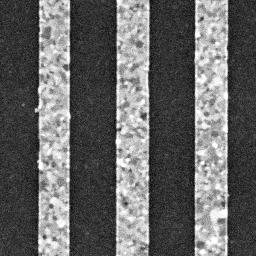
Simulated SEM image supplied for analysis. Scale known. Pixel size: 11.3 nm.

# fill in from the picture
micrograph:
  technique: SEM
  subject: one or a few lines or trenches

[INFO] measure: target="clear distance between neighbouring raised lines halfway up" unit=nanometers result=555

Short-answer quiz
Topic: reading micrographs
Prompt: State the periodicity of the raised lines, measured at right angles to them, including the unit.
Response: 891 nm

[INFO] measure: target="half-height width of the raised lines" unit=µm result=0.346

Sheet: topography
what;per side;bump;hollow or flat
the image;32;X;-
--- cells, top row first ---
-----XXXX------XXX-------XXX----
-----XXXX------XXX-------XXX----
-----XXXX------XXX-------XXX----
-----XXXX------XXX-------XXX----
-----XXXX------XXX-------XXX----
-----XXXX------XXX-------XXX----
-----XXXX------XXX-------XXX----
-----XXXX------XXX------XXXX----
-----XXXX------XXX-------XXX----
-----XXXX------XXX-------XXX----
-----XXXX------XXX-------XXX----
-----XXXX------XXX-------XXX----
-----XXXX------XXX-------XXX----
-----XXXX------XXX-------XXX----
-----XXXX------XXX-------XXX----
-----XXXX------XXX-------XXX----
-----XXXX------XXX-------XXX----
-----XXXX------XXX-------XXX----
-----XXX-------XXX-------XXX----
-----XXX-------XXX-------XXX----
-----XXX-------XXX-------XXX----
-----XXX-------XXX-------XXX----
-----XXX-------XXX-------XXX----
-----XXX-------XXX-------XXX----
-----XXX-------XXX-------XXX----
-----XXX-------XXX-------XXX----
-----XXX-------XXX-------XXX----
-----XXX-------XXX-------XXX----
-----XXX-------XXX-------XXX----
-----XXX-------XXX-------XXX----
-----XXX-------XXX-------XXX----
-----XXX-------XXX-------XXX----